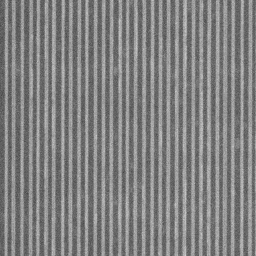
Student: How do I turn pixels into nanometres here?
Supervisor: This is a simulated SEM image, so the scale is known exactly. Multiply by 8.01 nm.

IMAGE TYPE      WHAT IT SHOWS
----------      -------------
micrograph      parallel lines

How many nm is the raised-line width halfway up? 24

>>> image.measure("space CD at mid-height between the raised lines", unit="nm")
43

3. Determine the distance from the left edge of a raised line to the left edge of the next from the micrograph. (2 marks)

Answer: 65.1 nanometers